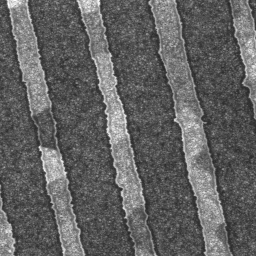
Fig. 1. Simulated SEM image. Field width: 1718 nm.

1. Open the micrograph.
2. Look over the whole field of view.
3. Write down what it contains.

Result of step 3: one or a few lines or trenches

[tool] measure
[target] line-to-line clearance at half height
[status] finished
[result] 345 nm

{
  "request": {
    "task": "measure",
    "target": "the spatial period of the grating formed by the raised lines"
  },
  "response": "478 nm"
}